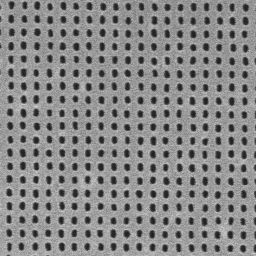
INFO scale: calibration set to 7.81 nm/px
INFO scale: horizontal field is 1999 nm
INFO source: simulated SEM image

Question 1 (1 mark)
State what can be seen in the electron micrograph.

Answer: a regular array of holes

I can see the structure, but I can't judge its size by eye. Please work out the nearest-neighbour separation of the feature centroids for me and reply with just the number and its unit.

0.0992 microns